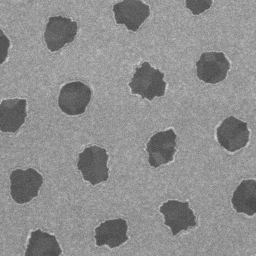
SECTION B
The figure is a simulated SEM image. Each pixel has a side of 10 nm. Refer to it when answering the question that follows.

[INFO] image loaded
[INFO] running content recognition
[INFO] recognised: a regular array of raised bodies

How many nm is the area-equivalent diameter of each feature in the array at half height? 350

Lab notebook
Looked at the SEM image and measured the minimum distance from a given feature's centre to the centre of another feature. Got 672 nanometres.